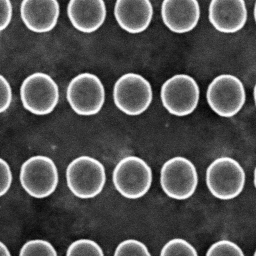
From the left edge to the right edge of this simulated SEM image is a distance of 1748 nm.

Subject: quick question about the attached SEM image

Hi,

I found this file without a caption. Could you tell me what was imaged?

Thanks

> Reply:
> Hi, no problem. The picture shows a regular array of raised bodies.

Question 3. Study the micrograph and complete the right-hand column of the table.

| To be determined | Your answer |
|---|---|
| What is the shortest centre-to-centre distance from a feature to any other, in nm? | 316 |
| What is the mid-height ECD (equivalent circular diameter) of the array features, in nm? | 261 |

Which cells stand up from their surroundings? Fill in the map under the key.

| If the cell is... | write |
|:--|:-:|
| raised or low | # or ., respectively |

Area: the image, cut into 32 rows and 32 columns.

#..####..####..####.#####.####..
#..####..####.#####.#####.#####.
#..####..####..####..####.#####.
....##....##....##...###...###..
................................
................................
................................
................................
................................
....##....##....#...............
#..####..####..###...###..####..
#..####..####.#####.#####.####..
#..####..####.#####.#####.####..
#..####..###...###...###...###..
................................
................................
................................
................................
................................
................................
#..####..###...###...###...###..
#..####.#####.#####.####..####..
#..####.#####.#####.####..####..
#..####..####..###..####..####..
....##....#.....#....###...##...
................................
................................
................................
................................
................................
...###...###...###...##....##...
#..####..####.####..####..####..